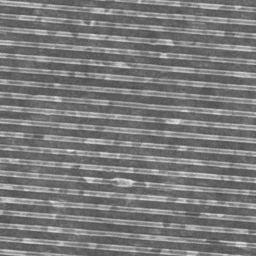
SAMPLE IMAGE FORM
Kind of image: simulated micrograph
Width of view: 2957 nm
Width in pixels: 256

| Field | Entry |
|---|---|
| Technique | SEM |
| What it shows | parallel lines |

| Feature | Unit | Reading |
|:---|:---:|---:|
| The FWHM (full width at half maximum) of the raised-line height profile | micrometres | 0.0432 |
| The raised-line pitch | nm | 151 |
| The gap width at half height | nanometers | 104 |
